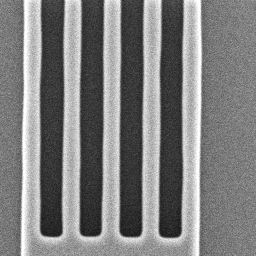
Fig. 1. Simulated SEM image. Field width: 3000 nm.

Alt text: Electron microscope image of groups of lines, slits or small figures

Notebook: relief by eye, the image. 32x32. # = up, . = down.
...##...##...##...##...##.......
...##...##...##...##...##.......
...##...##...##...##...##.......
...##...##...##...##...##.......
...##...##...##...##...##.......
...##...##...##...##...##.......
...##...##...##...##...##.......
...##...##...##...##...##.......
...##...##...##...##...##.......
...##...##...##...##...##.......
...##...##...##...##...##.......
...##...##...##...##...##.......
...##...##...##...##...##.......
...##...##...##...##...##.......
...##...##...##...##...##.......
...##...##...##...##...##.......
...##...##...##...##...##.......
...##...##...##...##...##.......
...##...##...##...##...##.......
...##...##...##...##...##.......
...##...##...##...##...##.......
...##...##...##...##...##.......
...##...##...##...##...##.......
...##...##...##...##...##.......
...##...##...##...##...##.......
...##...##...##...##...##.......
...##...##...##...##...##.......
...##...##...##...##...##.......
...##...##...##...##...##.......
...###.###..###..###..###.......
...######################.......
...######################.......